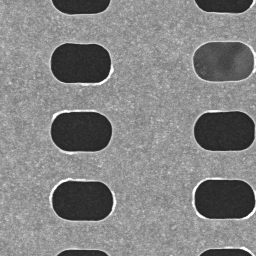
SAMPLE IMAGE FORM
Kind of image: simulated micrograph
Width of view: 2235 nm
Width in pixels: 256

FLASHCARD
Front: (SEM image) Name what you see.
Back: holes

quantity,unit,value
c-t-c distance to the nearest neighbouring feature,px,69.3